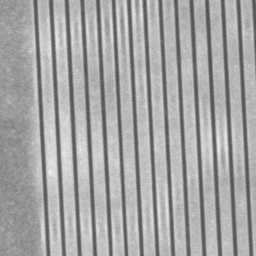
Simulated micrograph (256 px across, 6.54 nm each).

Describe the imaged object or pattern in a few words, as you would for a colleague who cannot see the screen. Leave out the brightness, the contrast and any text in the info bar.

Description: parallel lines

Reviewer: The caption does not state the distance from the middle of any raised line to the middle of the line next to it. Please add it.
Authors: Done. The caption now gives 102 nm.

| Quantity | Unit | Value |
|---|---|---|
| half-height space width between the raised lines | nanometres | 30.2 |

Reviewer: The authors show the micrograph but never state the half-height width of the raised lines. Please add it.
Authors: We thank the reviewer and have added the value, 72.6 nm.